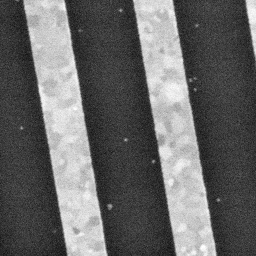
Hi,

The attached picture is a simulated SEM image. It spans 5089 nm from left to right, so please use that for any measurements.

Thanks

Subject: lines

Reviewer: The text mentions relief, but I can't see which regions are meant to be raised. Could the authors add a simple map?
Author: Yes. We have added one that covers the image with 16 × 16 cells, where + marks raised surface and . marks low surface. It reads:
..++....+++....+
..++.....++.....
..++.....++.....
..+++....++.....
..+++....+++....
..+++....+++....
...++....+++....
...++.....++....
...++.....++....
...+++....++....
...+++....+++...
...+++....+++...
....++....+++...
....++.....++...
....++.....++...
....+++....++...